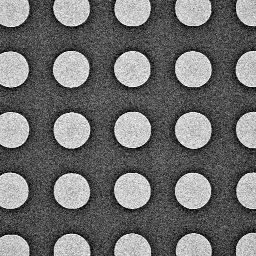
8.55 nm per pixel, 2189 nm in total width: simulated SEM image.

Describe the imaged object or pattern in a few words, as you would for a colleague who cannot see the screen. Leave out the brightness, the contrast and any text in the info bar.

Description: an array of small figures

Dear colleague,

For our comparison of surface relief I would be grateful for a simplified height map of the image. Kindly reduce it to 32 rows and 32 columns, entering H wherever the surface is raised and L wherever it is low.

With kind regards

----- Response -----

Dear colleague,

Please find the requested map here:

HHHHLLLHHHHLLLHHHHHLLLHHHHLLLLHH
HHHHLLLHHHHLLLHHHHHLLLHHHHLLLLHH
HHHLLLLHHHHLLLLHHHLLLLHHHHLLLLHH
LLLLLLLLLLLLLLLLLLLLLLLLLLLLLLLL
LLLLLLLLLLLLLLLLLLLLLLLLLLLLLLLL
LLLLLLLLLLLLLLLLLLLLLLLLLLLLLLLL
LHLLLLLLHHLLLLLLHLLLLLLLHLLLLLLH
HHHLLLLHHHHLLLLHHHLLLLHHHHLLLLHH
HHHHLLLHHHHLLLHHHHHLLLHHHHLLLLHH
HHHLLLLHHHHLLLLHHHHLLLHHHHLLLLHH
HHHLLLLLHHLLLLLHHHLLLLLHHLLLLLHH
LLLLLLLLLLLLLLLLLLLLLLLLLLLLLLLL
LLLLLLLLLLLLLLLLLLLLLLLLLLLLLLLL
LLLLLLLLLLLLLLLLLLLLLLLLLLLLLLLL
HHHLLLLLHHLLLLLHHHLLLLLHHLLLLLHH
HHHHLLLHHHHLLLHHHHHLLLHHHHLLLLHH
HHHHLLLHHHHLLLHHHHHLLLHHHHLLLLHH
HHHLLLLHHHHLLLLHHHLLLLHHHHLLLLHH
LLLLLLLLHHLLLLLLLLLLLLLLHLLLLLLL
LLLLLLLLLLLLLLLLLLLLLLLLLLLLLLLL
LLLLLLLLLLLLLLLLLLLLLLLLLLLLLLLL
LLLLLLLLLLLLLLLLLLLLLLLLLLLLLLLL
HHHLLLLHHHHLLLLHHHLLLLHHHHLLLLHH
HHHLLLLHHHHLLLHHHHHLLLHHHHLLLLHH
HHHLLLLHHHHLLLHHHHHLLLHHHHLLLLHH
HHHLLLLLHHHLLLLHHHLLLLLHHHLLLLHH
LLLLLLLLLLLLLLLLLLLLLLLLLLLLLLLL
LLLLLLLLLLLLLLLLLLLLLLLLLLLLLLLL
LLLLLLLLLLLLLLLLLLLLLLLLLLLLLLLL
LHLLLLLLHHLLLLLHHHLLLLLHHLLLLLLH
HHHLLLLHHHHLLLLHHHHLLLHHHHLLLLHH
HHHHLLLHHHHLLLHHHHHLLLHHHHLLLLHH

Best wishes